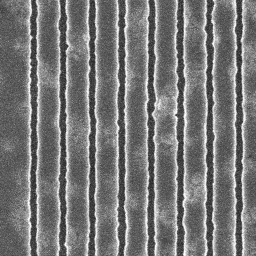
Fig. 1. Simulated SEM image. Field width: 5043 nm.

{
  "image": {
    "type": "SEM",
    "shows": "parallel lines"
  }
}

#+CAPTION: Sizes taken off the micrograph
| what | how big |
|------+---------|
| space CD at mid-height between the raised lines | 150 nm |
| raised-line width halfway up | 22.1 px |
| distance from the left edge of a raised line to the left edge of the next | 0.579 microns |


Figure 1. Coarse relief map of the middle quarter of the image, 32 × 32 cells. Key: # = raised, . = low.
.#####..######.######..#####..##
.#####..#####..######..#####..##
.#####..#####...#####..#####..##
.#####..#####...#####..#####..##
.#####..######..#####..#####...#
.#####..######..#####..#####...#
######..#####...#####..#####..##
######..#####..######..######.##
######..#####..######..#####..##
.#####..#####..######..#####..##
.#####..#####..######..#####..##
######..#####..######..#####..##
.#####..#####..######.######...#
.#####..#####..######..#####..##
.#####..#####..######..#####...#
.#####..#####..######..#####..##
.#####..######..#####..#####..##
.#####..#####...#####..#####..##
.#####..#####...#####..#####..##
.#####..#####...#####..#####..##
.#####..#####..######..#####..##
.#####..#####..######..#####..##
.#####..######..#####..#####..##
.#####..#####...#####..#####..##
.#####..#####...#####..#####..##
.#####..#####...#####..#####..##
.#####..#####...#####..#####..##
.#####..#####...#####..#####..##
######..#####..######..#####..##
.#####..#####..######..#####..##
.#####..#####..######..#####..##
.#####..#####..######..#####..##